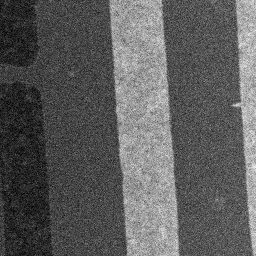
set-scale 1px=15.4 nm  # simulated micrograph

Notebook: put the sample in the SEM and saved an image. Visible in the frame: one or a few lines or trenches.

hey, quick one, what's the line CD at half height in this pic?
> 0.785 µm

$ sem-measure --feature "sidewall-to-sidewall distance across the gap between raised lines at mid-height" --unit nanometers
1140